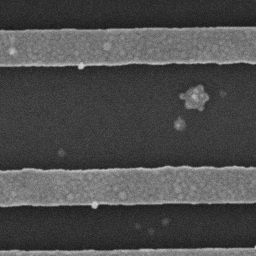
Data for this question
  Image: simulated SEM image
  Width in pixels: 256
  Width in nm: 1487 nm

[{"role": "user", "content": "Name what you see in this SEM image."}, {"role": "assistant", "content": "lines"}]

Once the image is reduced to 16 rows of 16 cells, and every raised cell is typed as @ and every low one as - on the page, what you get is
----------------
----------------
@@@@@@@@@@@@@@@@
@@@@@@@@@@@@@@@@
----------------
----------------
----------------
----------------
----------------
----------------
----------@@@@@@
@@@@@@@@@@@@@@@@
@@@@@@@@@@@@@@@@
----------------
----------------
---------------@